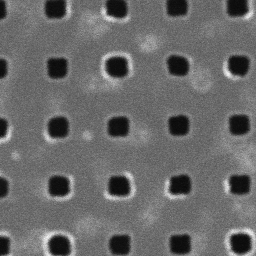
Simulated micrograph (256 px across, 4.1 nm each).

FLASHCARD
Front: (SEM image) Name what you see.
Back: a regular array of holes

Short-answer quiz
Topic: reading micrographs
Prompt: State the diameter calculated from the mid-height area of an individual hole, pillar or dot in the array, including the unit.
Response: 91.8 nm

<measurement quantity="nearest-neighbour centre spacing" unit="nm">243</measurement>